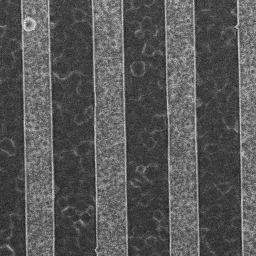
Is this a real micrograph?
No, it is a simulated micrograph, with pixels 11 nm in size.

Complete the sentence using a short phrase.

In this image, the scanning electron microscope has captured one or a few lines or trenches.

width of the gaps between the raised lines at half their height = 43.2 px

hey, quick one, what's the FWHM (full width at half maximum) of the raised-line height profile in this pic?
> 27.5 px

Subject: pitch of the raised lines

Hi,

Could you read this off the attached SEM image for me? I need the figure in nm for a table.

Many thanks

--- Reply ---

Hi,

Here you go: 784